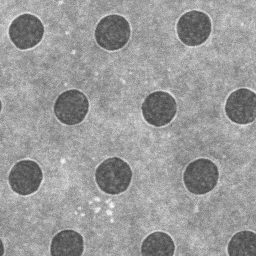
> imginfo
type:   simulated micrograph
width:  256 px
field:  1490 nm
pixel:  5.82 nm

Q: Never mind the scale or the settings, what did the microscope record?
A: a regular array of holes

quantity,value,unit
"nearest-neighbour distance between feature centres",0.47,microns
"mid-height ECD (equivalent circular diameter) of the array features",36.3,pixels